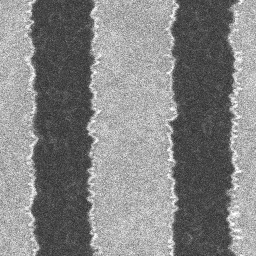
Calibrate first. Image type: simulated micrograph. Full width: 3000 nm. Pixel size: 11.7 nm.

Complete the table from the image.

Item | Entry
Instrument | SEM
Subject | one or a few lines or trenches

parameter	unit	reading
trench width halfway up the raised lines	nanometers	907